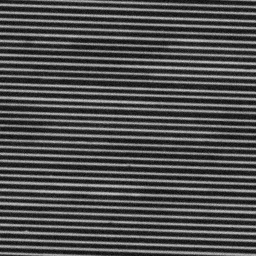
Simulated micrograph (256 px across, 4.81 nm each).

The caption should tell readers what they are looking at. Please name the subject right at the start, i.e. parallel lines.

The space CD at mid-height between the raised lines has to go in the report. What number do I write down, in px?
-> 5.11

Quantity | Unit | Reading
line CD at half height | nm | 8.4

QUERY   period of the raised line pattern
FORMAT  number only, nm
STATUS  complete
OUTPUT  34.1